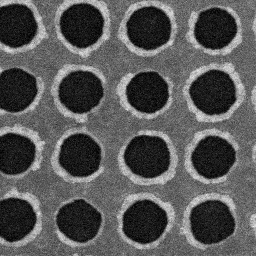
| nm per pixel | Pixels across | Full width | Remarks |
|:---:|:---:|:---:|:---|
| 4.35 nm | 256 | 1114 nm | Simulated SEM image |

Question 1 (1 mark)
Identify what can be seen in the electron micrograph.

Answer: a regular array of holes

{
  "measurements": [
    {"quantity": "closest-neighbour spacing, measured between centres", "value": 0.279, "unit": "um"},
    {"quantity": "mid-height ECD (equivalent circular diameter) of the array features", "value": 0.196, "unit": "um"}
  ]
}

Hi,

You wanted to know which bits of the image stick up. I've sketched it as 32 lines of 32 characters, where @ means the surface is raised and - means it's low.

@--@@@@@@--@@@@@@@@@@@@@@@@@@@@@
----@@@@-----@@@@----@@@@----@@@
----@@@------@@@-----@@@@----@@@
-----@@------@@@-----@@@------@@
----@@@@-----@@@-----@@@-----@@@
----@@@@@---@@@@@----@@@@----@@@
@@@@@@@@@@@@@@@@@@@@@@@@@@@@@@@@
@@@@@@@@@@@@@@@@@@@@@@@@@@@@@@@@
@--@@@@@@@@@@@@@@@@@@@@@@@@@@@@@
----@@@@----@@@@@---@@@@@----@@@
-----@@------@@@-----@@@-----@@@
-----@@------@@@-----@@@------@@
----@@@------@@@-----@@@------@@
---@@@@@----@@@@@---@@@@@----@@@
@@@@@@@@@@@@@@@@@@@@@@@@@@@@@@@@
@@@@@@@@@@@@@@@@@@@@@@@@@@@@@@@@
@@@@@@@@@@-@@@@@@@@@@@@@@@@@@@@@
----@@@@----@@@@----@@@@@---@@@@
-----@@@-----@@@-----@@@-----@@@
-----@@------@@------@@@------@@
----@@@------@@@-----@@@-----@@@
---@@@@@----@@@@-----@@@-----@@@
@@@@@@@@@@@@@@@@@@@@@@@@@@@@@@@@
@@@@@@@@@@@@@@@@@@@@@@@@@@@@@@@@
@@@@@@@@@@@@@@@@@@@@@@@@@@@@@@@@
----@@@@---@@@@@----@@@@@---@@@@
----@@@-----@@@@-----@@@-----@@@
-----@@------@@------@@@-----@@@
----@@@------@@------@@@-----@@@
----@@@@----@@@@----@@@@-----@@@
@@@@@@@@@@-@@@@@@@-@@@@@@@-@@@@@
@@@@@@@@@@@@@@@@@@@@@@@@@@@@@@@@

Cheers